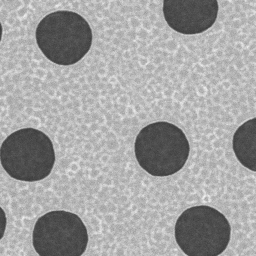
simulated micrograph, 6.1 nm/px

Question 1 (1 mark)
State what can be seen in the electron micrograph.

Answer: holes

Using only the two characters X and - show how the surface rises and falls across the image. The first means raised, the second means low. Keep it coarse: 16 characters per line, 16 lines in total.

XXXXXXXXXX----XX
XX---XXXXXX--XXX
XX----XXXXXXXXXX
XXX--XXXXXXXXXXX
XXXXXXXXXXXXXXXX
XXXXXXXXXXXXXXXX
XXXXXXXXXXXXXXXX
XXXXXXXXXXXXXXXX
X--XXXXXX---XXX-
---XXXXX----XXX-
---XXXXXX--XXXX-
XXXXXXXXXXXXXXXX
XXXXXXXXXXXXXXXX
XXX--XXXXXX---XX
XX---XXXXXX---XX
XX---XXXXXX---XX